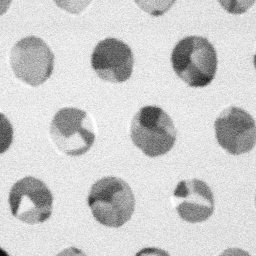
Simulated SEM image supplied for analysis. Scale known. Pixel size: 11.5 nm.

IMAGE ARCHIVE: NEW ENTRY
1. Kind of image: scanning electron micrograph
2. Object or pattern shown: a regular array of raised bodies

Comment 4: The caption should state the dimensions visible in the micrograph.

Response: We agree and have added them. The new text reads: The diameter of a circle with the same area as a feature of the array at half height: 49.6 px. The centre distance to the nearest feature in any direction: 0.93 um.